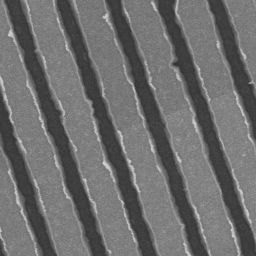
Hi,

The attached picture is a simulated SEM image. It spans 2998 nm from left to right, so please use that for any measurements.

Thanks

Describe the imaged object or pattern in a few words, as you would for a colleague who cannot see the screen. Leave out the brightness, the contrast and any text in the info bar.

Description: parallel lines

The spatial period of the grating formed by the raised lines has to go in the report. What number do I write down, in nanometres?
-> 560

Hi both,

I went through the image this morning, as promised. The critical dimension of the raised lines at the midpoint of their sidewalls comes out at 31.9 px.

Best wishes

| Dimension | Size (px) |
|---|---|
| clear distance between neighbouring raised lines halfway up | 16.4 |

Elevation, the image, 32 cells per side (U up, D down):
UDDUUUUDDUUUUDDUUUUUDDUUUUDDUUUU
UDDUUUUDDUUUUUDDUUUUDDUUUUDDDUUU
UDDUUUUDDDUUUUDDUUUUDDUUUUUDDUUU
UUDDUUUUDDUUUUDDUUUUUDDUUUUDDUUU
UUDDUUUUDDUUUUDDDUUUUDDUUUUDDDUU
UUDDUUUUUDDUUUUDDUUUUDDUUUUUDDUU
UUUDDUUUUDDUUUUDDUUUUUDDUUUUDDUU
UUUDDUUUUDDUUUUUDDUUUUDDUUUUDDUU
UUUDDUUUUUDDUUUUDDUUUUDDUUUUUDDU
UUUUDDUUUUDDUUUUDDUUUUUDDUUUUDDU
UUUUDDUUUUDDUUUUUDDUUUUDDUUUUDDD
UUUUDDUUUUUDDUUUUDDUUUUDDUUUUUDD
UUUUUDDUUUUDDUUUUDDUUUUUDDUUUUDD
DUUUUDDUUUUUDUUUUUDDUUUUDDUUUUDD
DUUUUDDDUUUUDDUUUUDDUUUUDDDUUUUD
DDUUUUDDUUUUDDUUUUDDDUUUUDDUUUUD
DDUUUUDDUUUUDDUUUUUDDUUUUDDUUUUD
DDUUUUDDDUUUUDDUUUUDDUUUUDDDUUUU
DDUUUUUDDUUUUDDUUUUDDUUUUUDDUUUU
UDDUUUUDDUUUUDDDUUUUDDUUUUDDUUUU
UDDUUUUUDDUUUUDDUUUUDDUUUUDDDUUU
UDDDUUUUDDUUUUDDUUUUDDDUUUUDDUUU
UUDDUUUUDDUUUUUDUUUUUDDUUUUDDUUU
UUDDUUUUDDDUUUUDDUUUUDDUUUUUDDUU
UUDDDUUUUDDUUUUDDUUUUDDUUUUUDDUU
UUUDDUUUUDDUUUUDDDUUUUDDUUUUDDUU
UUUDDUUUUDDDUUUUDDUUUUDDUUUUDDUU
UUUDDDUUUUDDUUUUDDUUUUUDDUUUUDDU
UUUUDDUUUUDDUUUUDDDUUUUDDUUUUDDU
UUUUDDUUUUDDDUUUUDDUUUUDDUUUUUDD
UUUUUDDUUUUDDUUUUDDUUUUDDDUUUUDD
DUUUUDDUUUUDDUUUUDDDUUUUDDUUUUDD